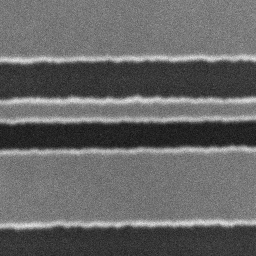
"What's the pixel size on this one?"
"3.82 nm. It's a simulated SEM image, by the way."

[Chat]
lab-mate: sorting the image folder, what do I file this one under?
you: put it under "lines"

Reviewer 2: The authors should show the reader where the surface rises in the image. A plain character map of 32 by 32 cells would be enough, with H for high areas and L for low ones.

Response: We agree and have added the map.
HHHHHHHHHHHHHHHHHHHHHHHHHHHHHHHH
HHHHHHHHHHHHHHHHHHHHHHHHHHHHHHHH
HHHHHHHHHHHHHHHHHHHHHHHHHHHHHHHH
HHHHHHHHHHHHHHHHHHHHHHHHHHHHHHHH
HHHHHHHHHHHHHHHHHHHHHHHHHHHHHHHH
HHHHHHHHHHHHHHHHHHHHHHHHHHHHHHHH
HHHHHHHHHHHHHHHHHHHHHHHHHHHHHHHH
HHHHHLHHHHHHLLHLLLLLLHLLLLHLLLLL
LLLLLLLLLLLLLLLLLLLLLLLLLLLLLLLL
LLLLLLLLLLLLLLLLLLLLLLLLLLLLLLLL
LLLLLLLLLLLLLLLLLLLLLLLLLLLLLLLL
LLLLLLLLLLLLLLLLLLLLLLLLLLLLLLLL
LLHHHHLLLHLHLHLHHHLHHHHHHHHHHHHH
HHHHHHHHHHHHHHHHHHHHHHHHHHHHHHHH
HHHHHHHHHHHHHHHHHHHHHHHHHHHHHHHH
LLLLLLLLLLLLLLLLLLLLLLLLLLLLLLLL
LLLLLLLLLLLLLLLLLLLLLLLLLLLLLLLL
LLLLLLLLLLLLLLLLLLLLLLLLLLLLLLLL
LLLLLLLLLLLLLLLLLLLLLLLLLLLLHHHL
HHHHHHHHHHHHHHHHHHHHHHHHHHHHHHHH
HHHHHHHHHHHHHHHHHHHHHHHHHHHHHHHH
HHHHHHHHHHHHHHHHHHHHHHHHHHHHHHHH
HHHHHHHHHHHHHHHHHHHHHHHHHHHHHHHH
HHHHHHHHHHHHHHHHHHHHHHHHHHHHHHHH
HHHHHHHHHHHHHHHHHHHHHHHHHHHHHHHH
HHHHHHHHHHHHHHHHHHHHHHHHHHHHHHHH
HHHHHHHHHHHHHHHHHHHHHHHHHHHHHHHH
HHHHHHHHHHHHHHHHHHHHHHHHHHHHHHHH
LLLLLLLLLLLLLLLLLLLLLLLLLLLLLLLL
LLLLLLLLLLLLLLLLLLLLLLLLLLLLLLLL
LLLLLLLLLLLLLLLLLLLLLLLLLLLLLLLL
LLLLLLLLLLLLLLLLLLLLLLLLLLLLLLLL